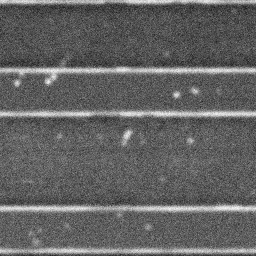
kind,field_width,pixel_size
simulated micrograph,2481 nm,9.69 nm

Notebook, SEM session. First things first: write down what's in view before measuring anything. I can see lines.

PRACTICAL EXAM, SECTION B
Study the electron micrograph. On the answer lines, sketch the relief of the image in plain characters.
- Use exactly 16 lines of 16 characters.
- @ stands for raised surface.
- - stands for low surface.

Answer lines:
----------------
----------------
----------------
----------------
@@@@@@@@@@@@@@@@
@@@@@@@@@@@@@@@@
@@@@@@@@@@@@@@@@
----------------
----------------
----------------
----------------
----------------
----------------
@@@@@@@@@@@@@@@@
@@@@@@@@@@@@@@@@
@@@@@@@@@@@@@@@@